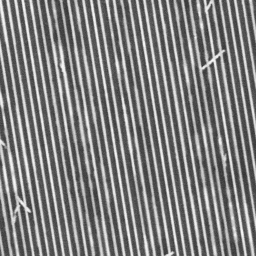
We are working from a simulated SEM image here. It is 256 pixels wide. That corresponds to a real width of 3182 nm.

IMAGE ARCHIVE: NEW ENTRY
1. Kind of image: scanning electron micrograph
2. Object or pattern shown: parallel lines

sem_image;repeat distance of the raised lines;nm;93.1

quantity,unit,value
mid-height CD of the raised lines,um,0.0122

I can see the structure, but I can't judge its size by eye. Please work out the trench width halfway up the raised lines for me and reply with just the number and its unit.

73.7 nm